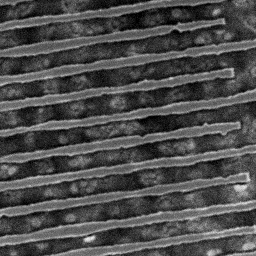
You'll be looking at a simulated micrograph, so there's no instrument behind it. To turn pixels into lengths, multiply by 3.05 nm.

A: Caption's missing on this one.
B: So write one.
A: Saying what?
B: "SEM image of parallel lines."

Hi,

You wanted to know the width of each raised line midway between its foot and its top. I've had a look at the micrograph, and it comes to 23.7 nm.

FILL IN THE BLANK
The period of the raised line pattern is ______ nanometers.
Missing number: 80.4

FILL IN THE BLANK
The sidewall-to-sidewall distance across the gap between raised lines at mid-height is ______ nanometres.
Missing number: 55.9